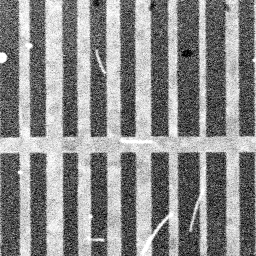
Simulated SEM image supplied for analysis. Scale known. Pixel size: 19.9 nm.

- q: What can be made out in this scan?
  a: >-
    groups of lines, slits or small figures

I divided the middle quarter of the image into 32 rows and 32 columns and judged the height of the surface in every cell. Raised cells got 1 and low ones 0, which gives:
00001100000111000011100000110000
00001100000111000011100000110000
00001100000111000011100000110000
00001100000111000011100000110000
00001100000111000011100000110000
00001100000111000011100000110000
00001100000111000011100000110000
00001100000111000011100000110000
00001100000111000011100000110000
00001100000111000011100000110000
00001100000111000011100000110000
00001100000111000011100000110000
00001100000111000011100000110000
00001100000111000011100000110000
00001100000111000011100000110000
00001100000111000011100000110000
00001100000111000011110000110000
00001100000111000011110000110000
00011110001111001111111111111111
11111111111111111111111111111111
11111111111111111111111111111111
11111111111111111111111111111111
00001100000111000011110000110000
00001100000111000011100000110000
00001100000111000011100000110000
00001100000111000011100000110000
00001100000111000011100000110000
00001100000111000011100000110000
00001100000111000011110000010000
00001100000111000011110000010000
00001100000111000011110000010000
00001100000111000011110000010000